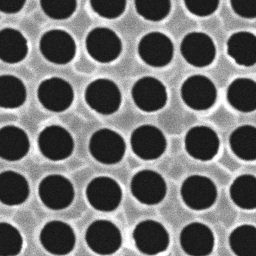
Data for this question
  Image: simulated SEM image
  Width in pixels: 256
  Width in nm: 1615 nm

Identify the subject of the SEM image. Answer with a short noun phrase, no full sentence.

a regular array of holes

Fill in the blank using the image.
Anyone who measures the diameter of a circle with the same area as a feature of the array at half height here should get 228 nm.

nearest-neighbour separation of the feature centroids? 287 nm